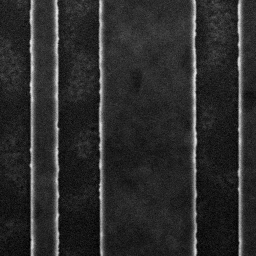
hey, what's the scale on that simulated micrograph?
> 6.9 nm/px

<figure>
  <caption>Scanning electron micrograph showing lines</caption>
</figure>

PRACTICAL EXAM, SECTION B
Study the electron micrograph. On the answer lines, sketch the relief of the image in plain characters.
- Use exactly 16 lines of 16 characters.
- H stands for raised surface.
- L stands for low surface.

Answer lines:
LLHHLLHHHHHHLLLH
LLHHLLHHHHHHLLLH
LLHHLLHHHHHHLLLH
LLHHLLHHHHHHLLLH
LLHHLLHHHHHHLLLH
LLHHLLHHHHHHLLLH
LLHHLLHHHHHHLLLH
LLHHLLHHHHHHLLLH
LLHHLLHHHHHHLLLH
LLHHLLHHHHHHLLLH
LLHHLLHHHHHHLLLH
LLHHLLHHHHHHLLLH
LLHHLLHHHHHHLLLH
LLHHLLHHHHHHLLLH
LLHHLLHHHHHHLLLH
LLHHLLHHHHHHLLLH